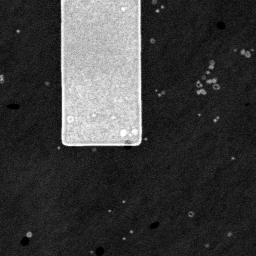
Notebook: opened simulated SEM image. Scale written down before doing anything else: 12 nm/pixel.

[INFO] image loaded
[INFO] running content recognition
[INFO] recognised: wiring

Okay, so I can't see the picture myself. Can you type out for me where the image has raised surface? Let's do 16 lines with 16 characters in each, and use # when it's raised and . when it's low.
....#####.......
....#####.......
....#####.......
....#####.......
....#####.......
....#####.......
....#####.......
....#####.......
....#####.......
................
................
................
................
................
................
................